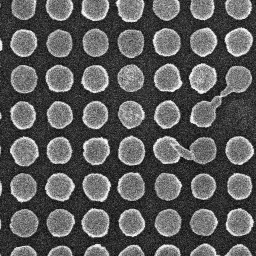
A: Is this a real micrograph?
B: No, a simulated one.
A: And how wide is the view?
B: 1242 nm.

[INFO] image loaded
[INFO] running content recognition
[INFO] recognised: a regular array of raised bodies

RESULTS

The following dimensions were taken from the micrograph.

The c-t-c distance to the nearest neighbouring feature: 172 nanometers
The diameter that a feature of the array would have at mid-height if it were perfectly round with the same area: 131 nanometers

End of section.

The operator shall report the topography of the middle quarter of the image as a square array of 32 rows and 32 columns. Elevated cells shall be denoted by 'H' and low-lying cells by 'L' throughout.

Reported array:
LLLLLLLLHLLLLLLLLLLLLLLLLHHHLLLL
HLLLLHHHHHLLLLLLLLLLLLLLHHHHHLLL
HHLLLHHHHHHLLLLLLLLLLLLHHHHHHLLL
HHLLLHHHHHHLLLLLLLLLLLLHHHHHHLLH
HHLLHHHHHHHLLLLLLLLLLLLHHHHHHLLL
HHLLLHHHHHHLLLLLLLLLLLLHHHHHHLLL
HLLLLLHHHHLLLLLLLLLLLLLLHHHHLLLL
LLLLLLLLLLLLLLLLLLLLLLLLLLLLLLLL
LLLLLLLLLLLLLLLLLLLLLLLLLLLLLLLL
LLLLLLLHHLLLLLLLLLLLLLLLLHHLLLLL
HLLLLLHHHHLLLLLLLLLLLLLLHHHHLLLL
HHLLLHHHHHHLLLLLLLLLLLLHHHHHHLLL
HHLLLHHHHHHLLLLLLLLLLLLHHHHHHLLL
HHLLLHHHHHHLLLLLLLLLLLLHHHHHHLLL
HHLLLHHHHHLLLLLLLLLLLLLHHHHHLLLL
LLLLLLHHHLLLLLLLLLLLLLLLHHHLLLLL
LLLLLLLLLLLLLLLLLLLLLLLLLLLLLLLL
LLLLLLLLLLLLLLLLLLLLLLLLLLLLLLLL
LLLLLLLLLLLLLLLLHHLLLLLLHHHLLLLL
HLLLLHHHHHHLLLHHHHHLLLLHHHHHLLLL
HHLLLHHHHHHLLLHHHHHHLLHHHHHHHLLL
HHLLLHHHHHHLLLHHHHHHLLHHHHHHHHHH
HHLLLHHHHHHLLLHHHHHHLLLHHHHHHHHH
HHLLLHHHHHHLLLHHHHHHLLLHHHHHHLHH
HLLLLLHHHHLLLLLHHHHLLLLLHHHHLLLL
LLLLLLLLLLLLLLLLLLLLLLLLLLLLLLLL
LLLLLLLLLLLLLLLLLLLLLLLLLLLLLLLL
LLLLLLLLLLLLLLLLHHHLLLLLHHLLLLLL
HLLLLHHHHHHLLLHHHHHLLLLHHHHHLLLL
HHLLLHHHHHHLLLHHHHHHLLLHHHHHHLLL
HHHLLHHHHHHHLHHHHHHHLLLHHHHHHLLL
HHLLLHHHHHHLLHHHHHHHLLLHHHHHHLLL